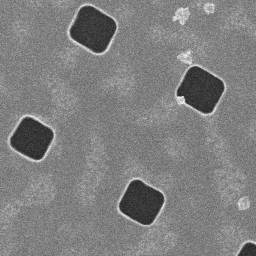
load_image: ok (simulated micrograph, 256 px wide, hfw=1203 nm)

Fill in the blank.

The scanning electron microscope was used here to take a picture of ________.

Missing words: holes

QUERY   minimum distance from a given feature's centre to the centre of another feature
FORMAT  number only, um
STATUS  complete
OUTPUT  0.586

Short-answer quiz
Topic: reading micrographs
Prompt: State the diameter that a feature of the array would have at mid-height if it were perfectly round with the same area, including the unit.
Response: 0.203 microns